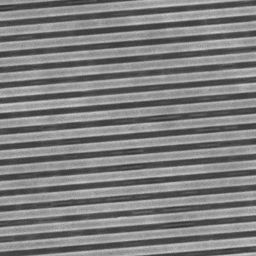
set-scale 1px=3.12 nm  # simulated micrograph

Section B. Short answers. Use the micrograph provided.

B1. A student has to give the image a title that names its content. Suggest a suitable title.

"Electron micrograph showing parallel lines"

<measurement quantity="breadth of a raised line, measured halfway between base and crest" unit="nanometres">25.7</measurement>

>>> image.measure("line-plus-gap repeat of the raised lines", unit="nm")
48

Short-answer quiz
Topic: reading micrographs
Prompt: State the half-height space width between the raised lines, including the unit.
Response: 0.0202 microns